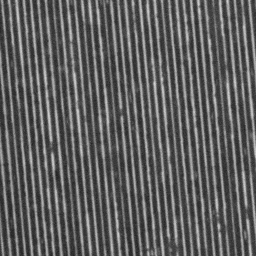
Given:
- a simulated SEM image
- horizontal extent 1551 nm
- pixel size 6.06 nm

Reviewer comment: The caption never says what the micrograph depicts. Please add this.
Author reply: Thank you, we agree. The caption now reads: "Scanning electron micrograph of parallel lines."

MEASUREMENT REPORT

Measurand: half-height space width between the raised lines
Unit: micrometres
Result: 0.0355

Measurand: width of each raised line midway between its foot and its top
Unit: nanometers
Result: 9.8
